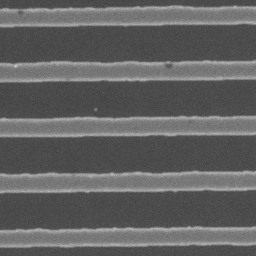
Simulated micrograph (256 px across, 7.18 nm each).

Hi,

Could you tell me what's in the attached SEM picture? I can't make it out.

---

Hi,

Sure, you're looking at lines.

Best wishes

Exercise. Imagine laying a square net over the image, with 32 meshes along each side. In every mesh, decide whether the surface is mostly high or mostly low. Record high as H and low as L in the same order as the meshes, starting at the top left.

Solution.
LLLLLLLLLLLLLLLLLLLLLLLLLLLLLLLL
HHHHHHHHHHHHHHHHHHHHHHHHHHHHHHHH
HHHHHHHHHHHHHHHHHHHHHHHHHHHHHHHH
LLLLLLLLLLLLLLLLLLLLLLLLLLLLLLLL
LLLLLLLLLLLLLLLLLLLLLLLLLLLLLLLL
LLLLLLLLLLLLLLLLLLLLLLLLLLLLLLLL
LLLLLLLLLLLLLLLLLLLLLLLLLLLLLLLL
LLLLLLLLLLLLLLLLLLLLLLLLLLLLLLLL
HHHHHHHHHHHHHHHHHHHHHHHHHHHHHHHH
HHHHHHHHHHHHHHHHHHHHHHHHHHHHHHHH
LLLLLLLLLLLLLLLLLLLLLLLLLLLLLLLL
LLLLLLLLLLLLLLLLLLLLLLLLLLLLLLLL
LLLLLLLLLLLLLLLLLLLLLLLLLLLLLLLL
LLLLLLLLLLLLLLLLLLLLLLLLLLLLLLLL
LLLLLLLLLLLLLLLLLLLLLLLLLLLLLLLL
HHHHHHHHHHHHHHHHHHHHHHHHHHHHHHHH
HHHHHHHHHHHHHHHHHHHHHHHHHHHHHHHH
LLLLLLLLLLLLLLLLLLLLLLLLLLLLLLLL
LLLLLLLLLLLLLLLLLLLLLLLLLLLLLLLL
LLLLLLLLLLLLLLLLLLLLLLLLLLLLLLLL
LLLLLLLLLLLLLLLLLLLLLLLLLLLLLLLL
LLLLLLLLLLLLLLLLLLLLLLLLHLLLLLHH
HHHHHHHHHHHHHHHHHHHHHHHHHHHHHHHH
HHHHHHHHHHHHHHHHHHHHHHHHHHHHHHHH
LLLLLLLLLLLLLLLLLLLLLLLLLLLLLLLL
LLLLLLLLLLLLLLLLLLLLLLLLLLLLLLLL
LLLLLLLLLLLLLLLLLLLLLLLLLLLLLLLL
LLLLLLLLLLLLLLLLLLLLLLLLLLLLLLLL
LLLLLLLLLLLLLLLLLLLLLLLLHLLLLLLH
HHHHHHHHHHHHHHHHHHHHHHHHHHHHHHHH
HHHHHHHHHHHHHHHHHHHHHHHHHHHHHHHH
LLLLLLLLLLLLLLLLLLLLLLLLLLLLLLLL